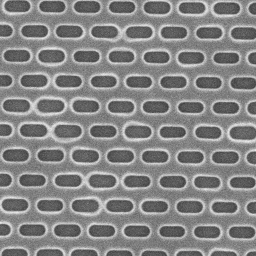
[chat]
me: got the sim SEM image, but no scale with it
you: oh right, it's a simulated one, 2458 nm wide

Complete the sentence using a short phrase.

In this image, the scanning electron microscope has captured groups of lines, slits or small figures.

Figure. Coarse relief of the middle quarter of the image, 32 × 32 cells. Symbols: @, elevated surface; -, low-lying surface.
@@@@@@@@@@@@@@@@@@@@@@@@@@@@@@@@
@@@@@@@@@@@@@@@@@@@@@@@@@@@@@@@@
@@@@@@@@@@@@@@@@@@@@@@@@@@@@@@@@
----@@@------@@@-----@@@@-----@@
----@@@------@@-------@@-------@
----@@@------@@@------@@------@@
@@@@@@@@@@@@@@@@@@@@@@@@@@@@@@@@
@@@@@@@@@@@@@@@@@@@@@@@@@@@@@@@@
@@@@@@@@@@@@@@@@@@@@@@@@@@@@@@@@
@@------@@@------@@@-----@@@@@--
@@-------@@-------@@------@@@---
@@-------@@-------@@------@@@---
@@@@@@@@@@@@@@@@@@@@@@@@@@@@@@@@
@@@@@@@@@@@@@@@@@@@@@@@@@@@@@@@@
@@@@@@@@@@@@@@@@@@@@@@@@@@@@@@@@
----@@@-----@@@@-----@@@@--@@@@@
----@@-------@@-------@@------@@
----@@@------@@-------@@------@@
---@@@@@----@@@@-----@@@@----@@@
@@@@@@@@@@@@@@@@@@@@@@@@@@@@@@@@
@@@@@@@@@@@@@@@@@@@@@@@@@@@@@@@@
@@@-----@@@@-----@@@@----@@@@@@@
@@-------@@------@@-------@@----
@@-------@@-------@-------@@----
@@@-----@@@@-----@@@------@@@---
@@@@@@@@@@@@@@@@@@@@@@@@@@@@@@@@
@@@@@@@@@@@@@@@@@@@@@@@@@@@@@@@@
@@@@@@@@-@@@@@@@@@@@@@@@@@@@@@@@
----@@-------@@------@@@------@@
----@@-------@@-------@@-------@
----@@-------@@------@@@------@@
@@@@@@@@@@@@@@@@@@@@@@@@@@@@@@@@